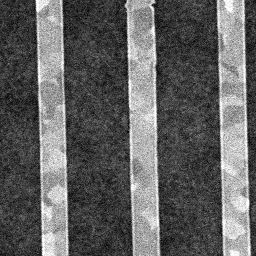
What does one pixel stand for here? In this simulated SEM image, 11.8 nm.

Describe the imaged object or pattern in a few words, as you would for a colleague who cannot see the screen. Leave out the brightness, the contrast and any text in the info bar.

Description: one or a few lines or trenches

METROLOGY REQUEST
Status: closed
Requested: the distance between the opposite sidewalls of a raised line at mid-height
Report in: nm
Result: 296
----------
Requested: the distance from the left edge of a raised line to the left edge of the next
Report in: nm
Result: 1070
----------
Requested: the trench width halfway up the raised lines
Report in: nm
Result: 778